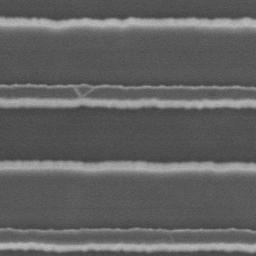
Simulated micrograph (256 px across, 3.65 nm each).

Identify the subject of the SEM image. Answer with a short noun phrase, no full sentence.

lines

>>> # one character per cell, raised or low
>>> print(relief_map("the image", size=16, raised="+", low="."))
................
+++.++++++++++.+
++++++++++++++++
++++++++++++++++
++++++++++++++++
++++++++++++++++
................
................
................
................
++++++++++.+++++
++++++++++++++++
++++++++++++++++
++++++++++++++++
++++++++++++++++
................